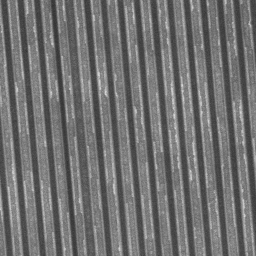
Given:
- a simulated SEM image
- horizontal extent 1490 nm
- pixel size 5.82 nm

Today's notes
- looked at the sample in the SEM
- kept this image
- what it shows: parallel lines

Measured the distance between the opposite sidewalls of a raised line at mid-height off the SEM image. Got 55.8 nm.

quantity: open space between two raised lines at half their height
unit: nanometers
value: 39.9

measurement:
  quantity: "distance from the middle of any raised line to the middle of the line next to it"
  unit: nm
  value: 96.3